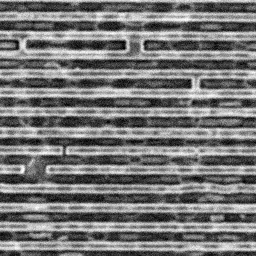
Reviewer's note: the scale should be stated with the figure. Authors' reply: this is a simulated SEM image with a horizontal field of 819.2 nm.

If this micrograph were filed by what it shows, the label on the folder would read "parallel lines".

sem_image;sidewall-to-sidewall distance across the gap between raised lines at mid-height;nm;40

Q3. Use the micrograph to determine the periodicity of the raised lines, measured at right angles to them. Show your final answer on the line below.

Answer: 61.2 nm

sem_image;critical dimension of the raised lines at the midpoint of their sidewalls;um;0.0216